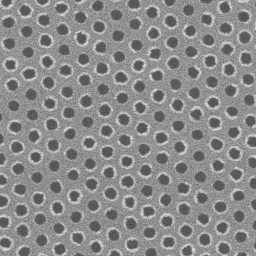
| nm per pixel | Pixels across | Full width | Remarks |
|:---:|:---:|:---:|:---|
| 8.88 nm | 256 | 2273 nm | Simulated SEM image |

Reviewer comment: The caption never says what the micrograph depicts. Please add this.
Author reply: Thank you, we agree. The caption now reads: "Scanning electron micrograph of a regular array of holes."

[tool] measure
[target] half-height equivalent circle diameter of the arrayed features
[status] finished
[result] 93.4 nm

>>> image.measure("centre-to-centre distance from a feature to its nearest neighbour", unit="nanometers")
182